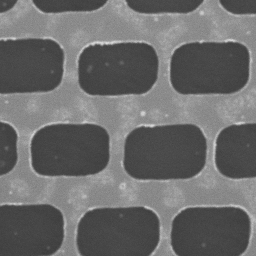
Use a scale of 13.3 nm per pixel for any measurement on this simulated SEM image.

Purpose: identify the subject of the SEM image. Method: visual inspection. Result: holes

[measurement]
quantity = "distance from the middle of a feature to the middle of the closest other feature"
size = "1240 nm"